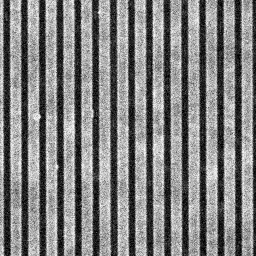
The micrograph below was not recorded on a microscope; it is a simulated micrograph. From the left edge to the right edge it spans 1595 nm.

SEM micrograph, parallel lines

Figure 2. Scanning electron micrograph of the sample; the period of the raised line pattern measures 111 nm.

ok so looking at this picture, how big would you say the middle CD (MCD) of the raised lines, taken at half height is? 67.7 nanometers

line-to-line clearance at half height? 42.8 nanometres